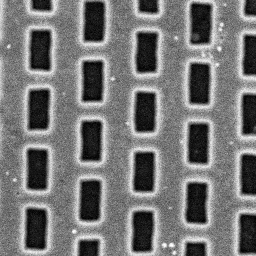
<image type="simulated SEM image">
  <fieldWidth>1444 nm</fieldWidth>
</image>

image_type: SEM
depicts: groups of lines, slits or small figures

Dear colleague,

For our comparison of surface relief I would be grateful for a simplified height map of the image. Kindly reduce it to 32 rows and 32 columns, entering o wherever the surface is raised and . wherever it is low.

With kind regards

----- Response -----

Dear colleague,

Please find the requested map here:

oooo...oooo..oooo...oooo..ooooo.
oooooooooo...ooooo..oooo...oooo.
oooooooooo...ooooooooooo...ooooo
oooooooooo...ooooooooooo...ooooo
oooo...ooo...oooo...oooo..ooooo.
oooo..ooooooooooo...oooo..oooo..
oooo..ooooooooooo...oooooooooo..
oooo..ooooo.ooooo...oooooooooo..
oooo..oooo...oooo...oooo..oooo..
oooooooooo...ooooooooooo..ooooo.
oooooooooo...oooooooooo...oooooo
oooo..oooo...oooo..ooooo..oooooo
ooo...oooo...oooo...oooo..oooo..
ooo...ooooooooooo...oooooooooo..
ooo...ooooooooooo..ooooooooooo..
ooo...oooo...oooo..ooooo..oooo..
oooooooooo...oooo..oooo...oooo..
oooooooooo...oooooooooo...oooooo
oooooooooo...oooooooooo...oooooo
ooo...oooo...oooo..oooo...oooo..
ooo...ooooooooooo..ooooo..oooo..
ooo...ooooooooooo..ooooooooooo..
ooo...ooooo.ooooo..ooooooooooo..
oooo..oooo...oooo..oooo...oooo..
oooooooooo...oooooooooo...oooooo
oooooooooo...oooooooooo...oooooo
ooo...oooo...oooo..oooo...oooooo
ooo...oooo..oooo...oooo...oooo..
ooo...ooooooooooo..ooooooooooo..
ooo...oooooooooo...ooooooooooo..
ooo...oooo..oooo...oooo...oooo..
oooooooooo..ooooo..oooo...oooo..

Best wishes